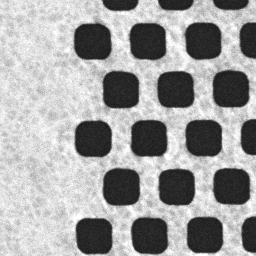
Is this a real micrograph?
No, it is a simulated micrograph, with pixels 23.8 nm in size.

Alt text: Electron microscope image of a regular array of holes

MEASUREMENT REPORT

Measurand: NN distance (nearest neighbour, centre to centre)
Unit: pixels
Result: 54.9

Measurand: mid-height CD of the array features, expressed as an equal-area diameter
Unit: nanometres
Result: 940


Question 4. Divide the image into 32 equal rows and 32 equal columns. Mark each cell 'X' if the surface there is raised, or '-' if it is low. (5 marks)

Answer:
XXXXXXXXXXXXX----XXX----XXX----X
XXXXXXXXXXXXXXXXXXXXXXXXXXXXXXXX
XXXXXXXXXXXXXXXXXXXXXXXXXXXXXXXX
XXXXXXXXXX---XXX----XXX----XXX--
XXXXXXXXX-----XX-----XX-----XX--
XXXXXXXXX-----XX-----XX-----XX--
XXXXXXXXX-----XX-----XX-----XX--
XXXXXXXXXXXXXXXXXX-XXXXXXXXXXXXX
XXXXXXXXXXXXXXXXXXXXXXXXXXXXXXXX
XXXXXXXXXXXXX----XXX----XXX----X
XXXXXXXXXXXXX----XXX----XXX----X
XXXXXXXXXXXXX----XXX----XX-----X
XXXXXXXXXXXXX----XXX----XXX----X
XXXXXXXXXXXXXX--XXXXX--XXXXXXXXX
XXXXXXXXXXXXXXXXXXXXXXXXXXXXXXXX
XXXXXXXXXX---XXXX---XXXX---XXX--
XXXXXXXXX-----XX-----XX-----XX--
XXXXXXXXX-----XX-----XX-----XX--
XXXXXXXXX-----XX-----XX-----XX--
XXXXXXXXXX---XXXX---XXXX--XXXXXX
XXXXXXXXXXXXXXXXXXXXXXXXXXXXXXXX
XXXXXXXXXXXXX----XXX----XXX----X
XXXXXXXXXXXXX-----XX----XXX----X
XXXXXXXXXXXXX-----XX----XXX----X
XXXXXXXXXXXXX----XXX----XXX----X
XXXXXXXXXXXXXX---XXXX---XXXX---X
XXXXXXXXXXXXXXXXXXXXXXXXXXXXXXXX
XXXXXXXXXX---XXXX---XXXX---XXXX-
XXXXXXXXX-----XX-----XX-----XX--
XXXXXXXXXX----XX-----XX-----XX--
XXXXXXXXXX----XXX----XX-----XX--
XXXXXXXXXX----XXX---XXXX---XXXX-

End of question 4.